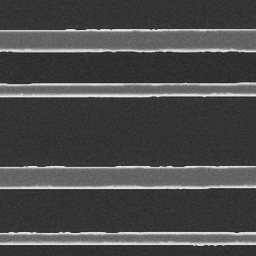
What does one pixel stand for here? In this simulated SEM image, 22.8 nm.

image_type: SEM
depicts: lines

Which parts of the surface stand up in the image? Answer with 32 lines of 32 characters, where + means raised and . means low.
................................
................................
................................
................................
++++++++++++++++++++++++++++++++
++++++++++++++++++++++++++++++++
................................
................................
................................
................................
+...++++++++++++++++++++++++++++
++++++++++++++++++++++++++++++++
................................
................................
................................
................................
................................
................................
................................
................................
................................
++++++++++++++++++++++++++++++++
++++++++++++++++++++++++++++++++
++++++++++++++++.++++...++......
................................
................................
................................
................................
................................
++++++++++++++++++++++++++++++++
++++++++++++++++++++++++++++++++
................................